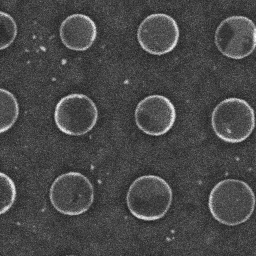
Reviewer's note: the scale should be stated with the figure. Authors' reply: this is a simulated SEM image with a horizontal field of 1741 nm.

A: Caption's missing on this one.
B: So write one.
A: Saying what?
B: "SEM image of a regular array of raised bodies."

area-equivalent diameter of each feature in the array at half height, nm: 285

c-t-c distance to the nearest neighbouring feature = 535 nm